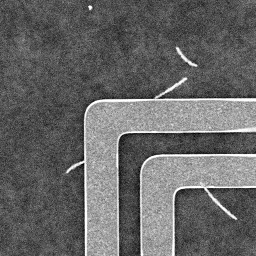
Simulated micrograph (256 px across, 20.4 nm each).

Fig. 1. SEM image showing groups of lines, slits or small figures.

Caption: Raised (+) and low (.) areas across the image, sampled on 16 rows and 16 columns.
................
................
................
................
................
................
......++++++++++
.....+++++++++++
.....+++........
.....++.........
.....++..+++++++
.....++..+++++++
.....++..++.....
.....++..++.....
.....++..++.....
.....++..++.....